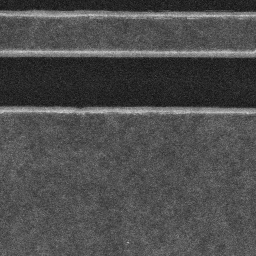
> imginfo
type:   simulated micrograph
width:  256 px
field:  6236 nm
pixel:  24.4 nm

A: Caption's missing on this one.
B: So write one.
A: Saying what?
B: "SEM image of one or a few lines or trenches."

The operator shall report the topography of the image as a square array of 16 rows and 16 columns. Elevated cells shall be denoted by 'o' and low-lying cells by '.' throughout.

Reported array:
................
oooooooooooooooo
oooooooooooooooo
................
................
................
................
oooooooooooooooo
oooooooooooooooo
oooooooooooooooo
oooooooooooooooo
oooooooooooooooo
oooooooooooooooo
oooooooooooooooo
oooooooooooooooo
oooooooooooooooo